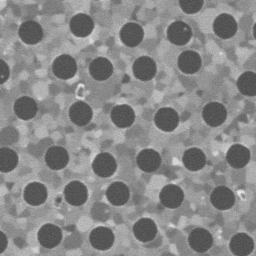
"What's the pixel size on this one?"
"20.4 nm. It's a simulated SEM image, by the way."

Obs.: a regular array of holes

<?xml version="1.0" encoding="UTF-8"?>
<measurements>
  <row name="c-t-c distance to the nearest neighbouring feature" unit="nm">868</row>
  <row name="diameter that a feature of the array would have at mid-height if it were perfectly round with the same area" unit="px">25.9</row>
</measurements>